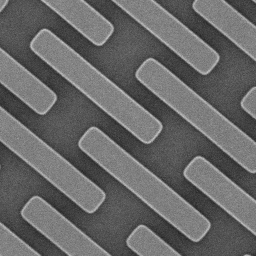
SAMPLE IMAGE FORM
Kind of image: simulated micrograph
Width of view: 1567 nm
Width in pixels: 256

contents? groups of lines, slits or small figures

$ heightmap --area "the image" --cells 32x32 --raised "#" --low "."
#.....#####....#####....#####...
.......#####....#####....#####..
........#####....#####....#####.
.........#####....#####....#####
.....##....###.....######...####
....####....#........#####...###
#...#####.............#####....#
##...######.......#....####.....
###....#####.....####...###.....
####....#####....#####..........
#####....#####....#####.........
.######...#####....#####.......#
...####....######...#####.....##
....##.......#####...######...##
#.............#####....#####...#
###............#####....#####...
####.......##...####.....#####..
#####.....####....#.......######
.#####....#####.............####
..######...#####.............###
....#####...######......##....##
.....#####....#####....#####...#
......#####....#####....#####...
.......#####....#####....#####..
........#####....#####....#####.
...###....###.....######...#####
...####....#........#####...####
...#####.............#####....##
#...######.......#....####.....#
##....#####.....####...##.......
###....#####....#####...........
####....#####....#####..........